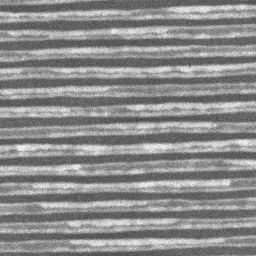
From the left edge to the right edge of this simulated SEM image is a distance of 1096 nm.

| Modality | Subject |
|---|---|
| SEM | parallel lines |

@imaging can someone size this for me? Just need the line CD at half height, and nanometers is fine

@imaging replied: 41.7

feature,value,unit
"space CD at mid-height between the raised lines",41.7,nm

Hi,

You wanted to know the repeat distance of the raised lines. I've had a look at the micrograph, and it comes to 82.1 nm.